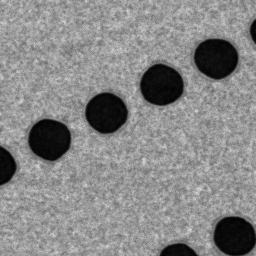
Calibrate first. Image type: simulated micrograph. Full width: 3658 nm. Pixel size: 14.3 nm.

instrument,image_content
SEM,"holes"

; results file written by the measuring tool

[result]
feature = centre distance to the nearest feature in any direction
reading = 0.876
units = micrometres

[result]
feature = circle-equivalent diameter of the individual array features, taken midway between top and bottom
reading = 604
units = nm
